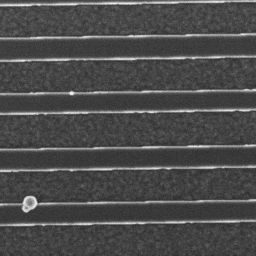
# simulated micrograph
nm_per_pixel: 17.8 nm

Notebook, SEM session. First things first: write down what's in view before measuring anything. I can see lines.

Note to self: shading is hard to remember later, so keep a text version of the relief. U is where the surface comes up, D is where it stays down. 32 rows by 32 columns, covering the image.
UUUUUUUUUUDDDDDDDDDDDDDDDDDDDDDD
DDDDDDDDDDDDDDDDDDDDDDDDDDDDDDDD
DDDDDDDDDDDDDDDDDDDDDDDDDDDDDDDD
DDDDDDDDDDDDDDDDDDDDDDDDDDDDDDDD
DDDDDDDDDDDDDDDDUUUUUUUUUUUUUUUU
UUUUUUUUUUUUUUUUUUUUUUUUUUUUUUUU
UUUUUUUUUUUUUUUUUUUUUUUUUUUUUUUU
UUUUUUUUUDDDDDDDDDDDDDDDDDDDDDDD
DDDDDDDDDDDDDDDDDDDDDDDDDDDDDDDD
DDDDDDDDDDDDDDDDDDDDDDDDDDDDDDDD
DDDDDDDDDDDDDDDDDDDDDDDDDDDDDDDD
DDDDDDDDDDDDDDDDDUUUUUUUUUUUUUUU
UUUUUUUUUUUUUUUUUUUUUUUUUUUUUUUU
UUUUUUUUUUUUUUUUUUUUUUUUUUUUUUUU
DDDDDDDDDDDDDDDDDDDDDDDDDDDDDDDD
DDDDDDDDDDDDDDDDDDDDDDDDDDDDDDDD
DDDDDDDDDDDDDDDDDDDDDDDDDDDDDDDD
DDDDDDDDDDDDDDDDDDDDDDDDDDDDDDDD
DDDDDDDDDDDUUUUUUUUUUUUUUUUUUUUU
UUUUUUUUUUUUUUUUUUUUUUUUUUUUUUUU
UUUUUUUUUUUUUUUUUUUUUUUUUUUUUUUU
DDDDDDDDDDDDDDDDDDDDDDDDDDDDDDDD
DDDDDDDDDDDDDDDDDDDDDDDDDDDDDDDD
DDDDDDDDDDDDDDDDDDDDDDDDDDDDDDDD
DDDDDDDDDDDDDDDDDDDDDDDDDDDDDDDD
DDUUUUUUUUUUUUUUUUUUUUUUUUUUUUUU
UUUUUUUUUUUUUUUUUUUUUUUUUUUUUUUU
UUUUUUUUUUUUUUUUUUUUUUUUUUUUUUUU
DDDDDDDDDDDDDDDDDDDDDDDDDDDDDDDD
DDDDDDDDDDDDDDDDDDDDDDDDDDDDDDDD
DDDDDDDDDDDDDDDDDDDDDDDDDDDDDDDD
DDDDDDDDDDDDDDDDDDDDDDDDDDDDDDDD